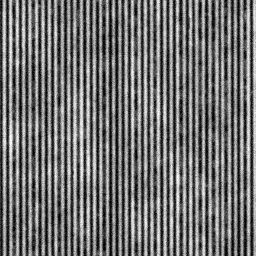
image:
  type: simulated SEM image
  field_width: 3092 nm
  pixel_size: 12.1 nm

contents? parallel lines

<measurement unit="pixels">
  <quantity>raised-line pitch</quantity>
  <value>6.42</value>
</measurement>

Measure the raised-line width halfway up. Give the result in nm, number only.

31.7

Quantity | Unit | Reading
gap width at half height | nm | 43.8